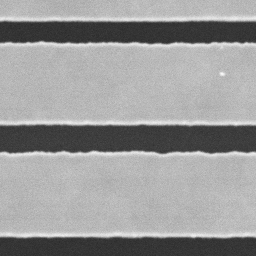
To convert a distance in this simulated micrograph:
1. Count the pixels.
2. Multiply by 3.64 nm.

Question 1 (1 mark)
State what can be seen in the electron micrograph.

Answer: lines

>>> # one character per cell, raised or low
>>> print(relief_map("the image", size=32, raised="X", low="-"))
XXXXXXXXXXXXXXXXXXXXXXXXXXXXXXXX
XXXXXXXXXXXXXXXXXXXXXXXXXXXXXXXX
XXXXXXXXXXXXXXXXXXXXXXXXXXXXXXXX
--------------------------------
--------------------------------
XXXXXXXXXXXXXXXXXXXXXXXXXXXXXXXX
XXXXXXXXXXXXXXXXXXXXXXXXXXXXXXXX
XXXXXXXXXXXXXXXXXXXXXXXXXXXXXXXX
XXXXXXXXXXXXXXXXXXXXXXXXXXXXXXXX
XXXXXXXXXXXXXXXXXXXXXXXXXXXXXXXX
XXXXXXXXXXXXXXXXXXXXXXXXXXXXXXXX
XXXXXXXXXXXXXXXXXXXXXXXXXXXXXXXX
XXXXXXXXXXXXXXXXXXXXXXXXXXXXXXXX
XXXXXXXXXXXXXXXXXXXXXXXXXXXXXXXX
XXXXXXXXXXXXXXXXXXXXXXXXXXXXXXXX
XXXXX-X-XXXXXXXXXXXXXXXXXXXXXXXX
--------------------------------
--------------------------------
--------------------------------
XXXXXXXXXXXXXXXXXXXXXXXXXXXXXXXX
XXXXXXXXXXXXXXXXXXXXXXXXXXXXXXXX
XXXXXXXXXXXXXXXXXXXXXXXXXXXXXXXX
XXXXXXXXXXXXXXXXXXXXXXXXXXXXXXXX
XXXXXXXXXXXXXXXXXXXXXXXXXXXXXXXX
XXXXXXXXXXXXXXXXXXXXXXXXXXXXXXXX
XXXXXXXXXXXXXXXXXXXXXXXXXXXXXXXX
XXXXXXXXXXXXXXXXXXXXXXXXXXXXXXXX
XXXXXXXXXXXXXXXXXXXXXXXXXXXXXXXX
XXXXXXXXXXXXXXXXXXXXXXXXXXXXXXXX
XXXXXXXXXXXXXXXXXXXXXXXXXXXXXXXX
--------------------------------
--------------------------------